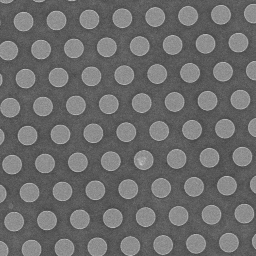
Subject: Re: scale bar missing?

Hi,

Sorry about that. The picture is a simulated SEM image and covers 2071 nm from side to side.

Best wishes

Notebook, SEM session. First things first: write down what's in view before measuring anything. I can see an array of small figures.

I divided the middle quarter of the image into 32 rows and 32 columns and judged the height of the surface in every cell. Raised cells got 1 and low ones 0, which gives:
00000000000000010000001100000011
00000111100001111000011110000111
10000111100001111000011111000111
10000111100001111000011110000011
10000111100001111000001110000001
00000000000000000000000000000000
00000000000000000000000000000000
00000000000000000000000000111000
01110000011110000111100000111100
01111000011111000111110001111100
01111000011111000111110000111100
01111000011110000011100000111000
00110000000000000000000000000000
00000000000000000000000000000000
00000000000000000000000000000001
00000011100000111000001111000011
10000111110001111100001111000011
10000111110001111100001111000011
10000111100000111000001110000001
00000001000000000000000000000000
00000000000000000000000000000000
00000000000000000000000000011000
00111000001110000011110000111100
01111100011111000011110000111100
01111100011111000011110000111100
01111100001111000011110000011100
00111000000110000000000000000000
00000000000000000000000000000000
00000000000000000000000000000000
00000001100000011100001111000011
11000011110000111100001111100011
11000011110000111100001111100011